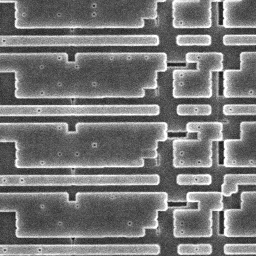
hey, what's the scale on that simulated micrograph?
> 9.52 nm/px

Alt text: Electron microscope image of wiring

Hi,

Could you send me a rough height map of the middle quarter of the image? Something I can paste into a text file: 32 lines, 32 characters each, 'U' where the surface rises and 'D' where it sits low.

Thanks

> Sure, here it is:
UUUUUUUUUUUUUUUUUUUUUUUUUUDDDDDD
UUUUUUUUUUUUUUUUUUUUUUUUUDDDDDDD
UUUUUUUUUUUUUUUUUUUUUUUDDDDUUUUU
UUUUUUUUUUUUUUUUUUUUUUUDDDDUUUUU
UUUUUUUUUUUUUUUUUUUUUUUDDDDUUUUU
UUUUUUUUUUUUUUUUUUUUUUUDDDDUUUUU
UUUUUUUUUUUUUUUUUUUUDDDDDDDUUUUU
UUUUUUUUUUUUUUUUUUUUDDDDDDDUUUUU
DDDDDDDDDDDDDDDDDDDDDDDDDDDDDDDD
DDDDDDDDDDDDDDDDDDDDDDDDDDDDDDDD
UUUUUUUUUUUUUUUUUUUUUUUDDDDDDUUU
UUUUUUUUUUUUUUUUUUUUUUUUDDDDUUUU
UUUUUUUUUUUUUUUUUUUUUUUDDDDDDUUU
DDDDDDDDDDDDDDDDDDDDDDDDDDDDDDDD
DDDDDDDDDDDDDDDDDDDDDDDDDDDDDDDD
UDDUUUUUUUUUUUUUUUUUUUUUUUDDDDDU
UDDUUUUUUUUUUUUUUUUUUUUUUUDDDDDU
UUUUUUUUUUUUUUUUUUUUUUUUUUDDDDDD
UUUUUUUUUUUUUUUUUUUUUUUUUUDDDDDD
UUUUUUUUUUUUUUUUUUUUUUUDDDDUUUUU
UUUUUUUUUUUUUUUUUUUUUUUDDDDUUUUU
UUUUUUUUUUUUUUUUUUUUUUUDDDDDUUUU
UUUUUUUUUUUUUUUUUUUUUUUDDDDDUDUU
UUUUUUUUUUUUUUUUUUUUDDDDDDDDUUUU
UUUUUUUUUUUUUUUUUUUUDDDDDDDDUUUU
UUUUUUUUUUUUUUUUUUUUDDDDDDDDUUUU
DDDDDDDDDDDDDDDDDDDDDDDDDDDDDDDD
DDDDDDDDDDDDDDDDDDDDDDDDDDDDDDDD
UUUUUUUUUUUUUUUUUUUUUUUUDDDDUUUU
UUUUUUUUUUUUUUUUUUUUUUUUDDDDUUUU
DDDDDDDDDDDDDDDDDDDDDDDDDDDDDDDD
DDDDDDDDDDDDDDDDDDDDDDDDDDDDDDDD